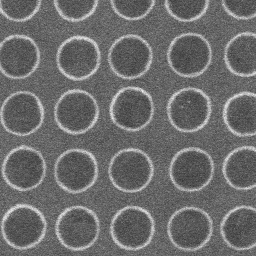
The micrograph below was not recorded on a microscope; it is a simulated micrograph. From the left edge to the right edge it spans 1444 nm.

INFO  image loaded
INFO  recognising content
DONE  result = a regular array of raised bodies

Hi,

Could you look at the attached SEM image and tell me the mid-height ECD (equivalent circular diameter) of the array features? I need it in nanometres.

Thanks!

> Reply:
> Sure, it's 241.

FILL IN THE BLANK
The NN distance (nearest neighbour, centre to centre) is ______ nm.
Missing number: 306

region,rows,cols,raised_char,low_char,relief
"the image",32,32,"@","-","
@@@@@--@@@@@--@@@@@--@@@@@--@@@@
@@@@---@@@@----@@@---@@@@----@@@
--@--------------------@--------
--------------------------------
-----------------------@@-----@@
@@@@----@@@@--@@@@---@@@@@---@@@
@@@@@--@@@@@--@@@@@--@@@@@--@@@@
@@@@@--@@@@@--@@@@@--@@@@@--@@@@
@@@@----@@@@--@@@@----@@@@---@@@
-@@-----@@@----@@---------------
--------------------------------
--------@@-----@@@----@@@-------
-@@@@--@@@@@--@@@@@--@@@@@---@@@
@@@@@--@@@@@--@@@@@--@@@@@--@@@@
@@@@@--@@@@@--@@@@@--@@@@@--@@@@
@@@@@--@@@@@---@@@----@@@@--@@@@
-@@@-----@-------------------@@@
--------------------------------
--@@--------------------------@-
-@@@@---@@@@--@@@@----@@@@---@@@
-@@@@@-@@@@@--@@@@@--@@@@@--@@@@
@@@@@@-@@@@@--@@@@@--@@@@@--@@@@
-@@@@--@@@@@--@@@@@---@@@@--@@@@
--@@----@@@----@@@-----@@-----@-
--------------------------------
--------------------------------
-@@@@---@@@----@@@----@@@----@@@
@@@@@--@@@@@--@@@@@--@@@@@--@@@@
@@@@@@-@@@@@--@@@@@--@@@@@--@@@@
-@@@@--@@@@@--@@@@@--@@@@@--@@@@
-@@@----@@@----@@@----@@@----@@@
--------------------------------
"